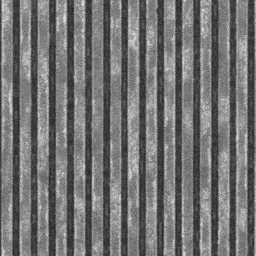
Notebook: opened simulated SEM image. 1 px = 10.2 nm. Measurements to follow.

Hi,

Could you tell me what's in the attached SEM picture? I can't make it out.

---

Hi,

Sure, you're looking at parallel lines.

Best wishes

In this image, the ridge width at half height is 107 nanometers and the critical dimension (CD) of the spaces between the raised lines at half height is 80.1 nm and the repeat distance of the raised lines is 184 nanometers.